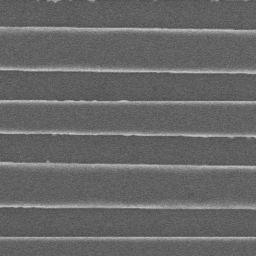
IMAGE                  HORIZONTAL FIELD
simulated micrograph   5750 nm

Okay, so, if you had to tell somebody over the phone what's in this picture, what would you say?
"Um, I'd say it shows lines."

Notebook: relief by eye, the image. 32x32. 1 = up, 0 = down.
00000000000000000000000000000000
00000000000000000000000000000000
00000000000000000000000000000000
10011100000000000000000000000000
11111111111111111111111111111111
11111111111111111111111111111111
11111111111111111111111111111111
11111111111111111111111111111111
11111111111111111111111111111111
00000000000000000000000000000000
00000000000000000000000000000000
00000000000000000000000000000000
00000000000000000000000000000000
11111111111111111111111111111111
11111111111111111111111111111111
11111111111111111111111111111111
11111111111111111111111111111111
00000000000000000000000000000000
00000000000000000000000000000000
00000000000000000000000000000000
11110000000000000000000000000000
11111111111111111111111111111111
11111111111111111111111111111111
11111111111111111111111111111111
11111111111111111111111111111111
11111111111111111111111111111111
00000000000000000000000000000000
00000000000000000000000000000000
00000000000000000000000000000000
00000000000000000000000000000000
11111111111111111111111111111111
11111111111111111111111111111111